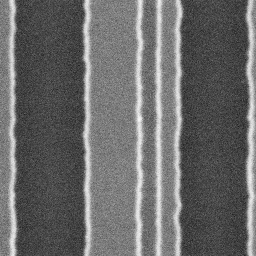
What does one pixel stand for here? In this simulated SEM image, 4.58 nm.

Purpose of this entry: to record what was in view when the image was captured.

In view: lines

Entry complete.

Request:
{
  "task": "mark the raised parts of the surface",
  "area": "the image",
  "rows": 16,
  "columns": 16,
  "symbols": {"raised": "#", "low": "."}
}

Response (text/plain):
#....######.....
#....######.....
#....######.....
#....######.....
#....######.....
#....######.....
#....######.....
#....######.....
#....######.....
#....######.....
#....######.....
#....######.....
#....######.....
#....######.....
#.....#####.....
#....######.....